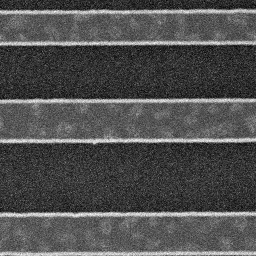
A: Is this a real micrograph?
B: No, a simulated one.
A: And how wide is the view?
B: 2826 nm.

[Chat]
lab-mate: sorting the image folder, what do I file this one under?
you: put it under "one or a few lines or trenches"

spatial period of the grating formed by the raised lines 1140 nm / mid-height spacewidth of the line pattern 724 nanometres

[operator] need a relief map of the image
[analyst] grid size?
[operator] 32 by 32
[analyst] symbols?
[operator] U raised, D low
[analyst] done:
DDDDDDDDDDDDDDDDDDDDDDDDDDDDDDDD
DDDDDDDDDDDDUDDDDDDDDDDDDDUUUUUU
UUUUUUUUUUUUUUUUUUUUUUUUUUUUUUUU
UUUUUUUUUUUUUUUUUUUUUUUUUUUUUUUU
UUUUUUUUUUUUUUUUUUUUUUUUUUUUUUUU
DDDDDDDDDDDDDDDDDDDDDDDDDDDDDDDD
DDDDDDDDDDDDDDDDDDDDDDDDDDDDDDDD
DDDDDDDDDDDDDDDDDDDDDDDDDDDDDDDD
DDDDDDDDDDDDDDDDDDDDDDDDDDDDDDDD
DDDDDDDDDDDDDDDDDDDDDDDDDDDDDDDD
DDDDDDDDDDDDDDDDDDDDDDDDDDDDDDDD
DDDDDDDDDDDDDDDDDDDDDDDDDDDDDDDD
DDDDDDDDDDDDDDDDDDDDDDDDDDDDDDDD
UUUUUUUUUUUUUUUUUUUUUUUUUUUUUUUU
UUUUUUUUUUUUUUUUUUUUUUUUUUUUUUUU
UUUUUUUUUUUUUUUUUUUUUUUUUUUUUUUU
UUUUUUUUUUUUUUUUUUUUUUUUUUUUUUUU
UUUUUUUUUUUUUDDUDDUUUUUUUDUUUUUD
DDDDDDDDDDDDDDDDDDDDDDDDDDDDDDDD
DDDDDDDDDDDDDDDDDDDDDDDDDDDDDDDD
DDDDDDDDDDDDDDDDDDDDDDDDDDDDDDDD
DDDDDDDDDDDDDDDDDDDDDDDDDDDDDDDD
DDDDDDDDDDDDDDDDDDDDDDDDDDDDDDDD
DDDDDDDDDDDDDDDDDDDDDDDDDDDDDDDD
DDDDDDDDDDDDDDDDDDDDDDDDDDDDDDDD
DDDDDDDDDDDDDDDDDDDDDDDDDDDDDDDD
DDDDDDDDDDDDDDDDDDDDDDDDDDDDDDDD
UUUUUUUUUUUUUUUUUUUUUUUUUUUUUUUU
UUUUUUUUUUUUUUUUUUUUUUUUUUUUUUUU
UUUUUUUUUUUUUUUUUUUUUUUUUUUUUUUU
UUUUUUUUUUUUUUUUUUUUUUUUUUUUUUUU
UUUUUUUUUUUUUUUUUUUUUUUUUUUUUUUU